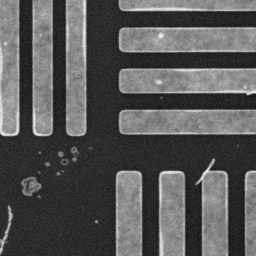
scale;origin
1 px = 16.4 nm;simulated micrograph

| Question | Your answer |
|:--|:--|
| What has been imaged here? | groups of lines, slits or small figures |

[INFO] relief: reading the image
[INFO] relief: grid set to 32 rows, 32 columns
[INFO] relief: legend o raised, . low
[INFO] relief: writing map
oo..oo..ooo....ooooooooooooooooo
oo..oo..ooo.....................
oo..oo..ooo.....................
oo..oo..ooo.....................
oo..oo..ooo....ooooooooooooooooo
oo..oo..ooo....ooooooooooooooooo
oo..ooo.ooo.....................
oo..ooo.ooo.....................
oo..oo..ooo.....................
oo..oo..ooo....ooooooooooooooooo
oo..ooo.ooo....ooooooooooooooooo
oo..ooo.ooo....oooo.ooo..oo...oo
oo..ooo.ooo.....................
oo..ooo.ooo.....................
oo..ooo.ooo....ooooooooooooooooo
oo..ooo.ooo....ooooooooooooooooo
oo..oo..ooo....ooooooooooooooooo
................................
................................
................................
................................
...............oo.....o...oo...o
...............ooo..ooo..ooo...o
...............ooo..ooo..ooo...o
...............ooo..ooo..ooo...o
...............ooo..ooo..ooo...o
...............ooo..ooo..ooo...o
...............ooo..ooo..ooo...o
...............ooo..ooo..ooo...o
...............ooo..ooo..ooo...o
...............ooo..ooo..ooo...o
...............ooo..ooo..ooo...o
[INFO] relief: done